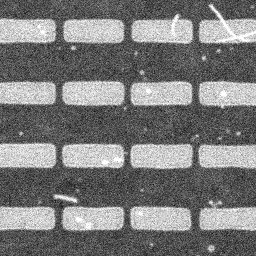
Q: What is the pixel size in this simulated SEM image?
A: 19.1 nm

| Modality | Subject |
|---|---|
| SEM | groups of lines, slits or small figures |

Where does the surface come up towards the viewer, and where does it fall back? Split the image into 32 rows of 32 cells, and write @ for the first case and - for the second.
@@@@@@@@@@@@@@@@@@@@@@@@@@@@@@@@
@@@@@@@@@@@@@@@@@@@@@@@@@@@@@@@@
-@@@@@@@@@@@@@@@@@@@@@@@@@@@@@@@
-------@-------@@-------@-------
-------@-------@@-------@-------
@@@@@@@@@@@@@@@@@@@@@@@@@@@@@@@@
@@@@@@@@@@@@@@@@@@@@@@@@@@@@@@@@
@@@@@@@@@@@@@@@@@@@@@@@@@@@@@@@@
@@@@@@@@@@@@@@@@@@@@@@@@@@@@@@@@
@@@@@@@@@@@@@@@@@@@@@@@@@@@@@@@@
------@@-------@@------@@@------
-------@-------@--------@-------
-------@-------@@-------@-------
@@@@@@@@@@@@@@@@@@@@@@@@@@@@@@@@
@@@@@@@@@@@@@@@@@@@@@@@@@@@@@@@@
@@@@@@@@@@@@@@@@@@@@@@@@@@@@@@@@
@@@@@@@@@@@@@@@@@@@@@@@@@@@@@@@@
@@@@@@@@@@@@@@@@@@@@@@@@@@@@@@@@
-------@-------@@-------@-------
-------@-------@--------@-------
-------@-------@@-------@-------
@@@@@@@@@@@@@@@@@@@@@@@@@@@@@@@@
@@@@@@@@@@@@@@@@@@@@@@@@@@@@@@@@
@@@@@@@@@@@@@@@@@@@@@@@@@@@@@@@@
@@@@@@@@@@@@@@@@@@@@@@@@@@@@@@@@
@@@@@@@@@@@@@@@@@@@@@@@@@@@@@@@@
-------@-------@-------@@-------
-------@-------@--------@-------
------@@-------@@------@@-------
@@@@@@@@@@@@@@@@@@@@@@@@@@@@@@@@
@@@@@@@@@@@@@@@@@@@@@@@@@@@@@@@@
@@@@@@@@@@@@@@@@@@@@@@@@@@@@@@@@